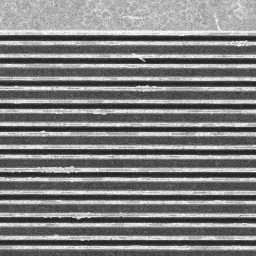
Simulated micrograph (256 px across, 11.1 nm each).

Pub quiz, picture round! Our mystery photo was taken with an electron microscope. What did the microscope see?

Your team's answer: parallel lines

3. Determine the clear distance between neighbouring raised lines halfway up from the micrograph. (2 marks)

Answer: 65.1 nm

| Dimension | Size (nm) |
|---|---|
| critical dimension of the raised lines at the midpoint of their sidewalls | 47.1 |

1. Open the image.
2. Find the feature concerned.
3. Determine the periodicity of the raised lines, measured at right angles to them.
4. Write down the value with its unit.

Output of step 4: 125 nanometres